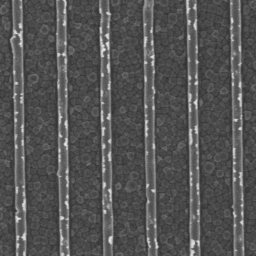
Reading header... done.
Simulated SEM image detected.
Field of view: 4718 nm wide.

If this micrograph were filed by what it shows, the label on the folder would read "parallel lines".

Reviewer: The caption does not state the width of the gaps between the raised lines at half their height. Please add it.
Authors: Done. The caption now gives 624 nm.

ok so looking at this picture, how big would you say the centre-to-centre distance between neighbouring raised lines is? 43.6 px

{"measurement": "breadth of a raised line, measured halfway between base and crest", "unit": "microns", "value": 0.173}